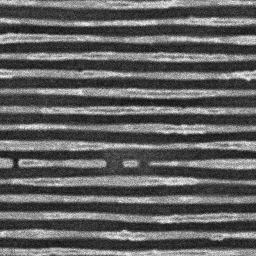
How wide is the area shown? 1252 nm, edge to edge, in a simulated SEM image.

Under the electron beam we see parallel lines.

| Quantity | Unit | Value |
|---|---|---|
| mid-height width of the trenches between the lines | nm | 54.4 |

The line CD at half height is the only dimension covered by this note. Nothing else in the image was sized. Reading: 0.036 microns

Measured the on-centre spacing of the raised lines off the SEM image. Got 86.6 nanometres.